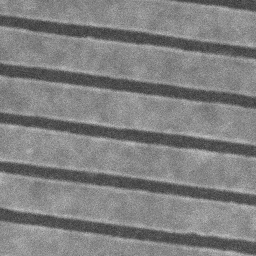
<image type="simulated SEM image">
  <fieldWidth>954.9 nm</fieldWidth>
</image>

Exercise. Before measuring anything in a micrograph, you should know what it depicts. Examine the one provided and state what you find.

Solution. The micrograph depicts parallel lines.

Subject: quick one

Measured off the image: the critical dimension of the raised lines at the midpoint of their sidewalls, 131 nanometers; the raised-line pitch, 180 nanometres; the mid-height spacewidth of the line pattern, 50.4 nanometers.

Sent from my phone